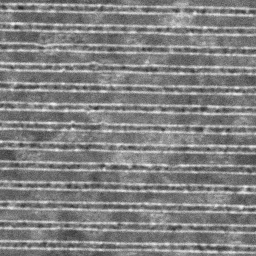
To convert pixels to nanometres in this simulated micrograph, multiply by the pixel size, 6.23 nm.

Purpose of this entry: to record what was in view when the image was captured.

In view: parallel lines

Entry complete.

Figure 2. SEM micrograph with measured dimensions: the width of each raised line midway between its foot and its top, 44.4 nanometres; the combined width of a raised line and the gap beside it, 0.123 µm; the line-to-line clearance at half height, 77.9 nm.